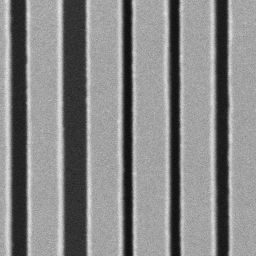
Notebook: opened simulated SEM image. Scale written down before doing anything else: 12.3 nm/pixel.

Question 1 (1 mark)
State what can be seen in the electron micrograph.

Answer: lines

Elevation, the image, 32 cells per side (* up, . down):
*..*****...****.*****..****..***
*..*****...****..****..****..***
*..*****...****..****..****..***
*..*****...****..****..****..***
*..*****...****..****..****..***
*..*****...****..****..****..***
*..*****...****..****..****..***
*..*****...****..****..****..***
*..*****...****..****..****..***
*..*****...****..****..****..***
*..*****...****..****..****..***
*..*****...****..****..****..***
*..*****...****..****..****..***
*..*****...****..****..****..***
*..*****...****..****..****..***
*..*****...****..****..****..***
*..*****...****..****..****..***
*..*****...****..****..****..***
*..*****...****..****..****..***
*..*****...****..****..****..***
*..*****...****..****..****..***
*..*****...****..****..****..***
*..*****...****..****..****..***
*..*****...****..****..****..***
*..*****...****..****..****..***
*..*****...****..****..****..***
*..*****...****..****..****..***
*...****...****..****..****..***
*..*****...****..****..****..***
*...****...****..****..****..***
*...****...****..****..****..***
*...****...****..****..****..***